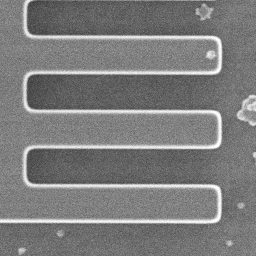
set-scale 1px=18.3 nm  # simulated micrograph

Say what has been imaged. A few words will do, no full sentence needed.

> groups of lines, slits or small figures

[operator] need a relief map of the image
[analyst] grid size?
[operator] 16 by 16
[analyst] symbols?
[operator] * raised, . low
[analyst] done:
**..............
**..............
*************...
**************..
*************...
**..............
**..............
**************..
**************..
**..............
**..............
**..............
**************..
**************..
................
................